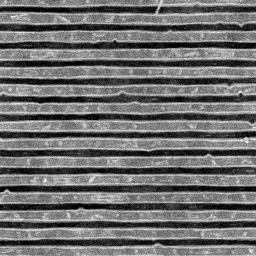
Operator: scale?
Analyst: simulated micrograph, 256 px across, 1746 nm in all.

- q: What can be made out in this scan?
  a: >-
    parallel lines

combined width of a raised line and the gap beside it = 0.122 microns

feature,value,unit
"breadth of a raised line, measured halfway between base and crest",10.9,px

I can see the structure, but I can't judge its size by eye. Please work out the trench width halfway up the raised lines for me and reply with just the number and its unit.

0.0477 microns